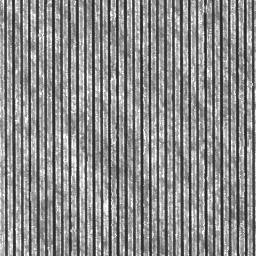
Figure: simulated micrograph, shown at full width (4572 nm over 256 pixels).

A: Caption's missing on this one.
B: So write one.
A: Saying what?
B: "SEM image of parallel lines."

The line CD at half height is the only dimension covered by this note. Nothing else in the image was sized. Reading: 84.8 nanometres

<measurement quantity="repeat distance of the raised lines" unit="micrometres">0.143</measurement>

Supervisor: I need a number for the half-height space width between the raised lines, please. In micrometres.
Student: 0.0513